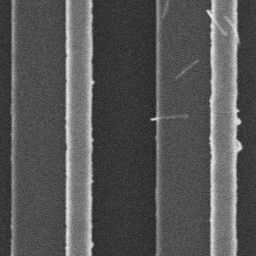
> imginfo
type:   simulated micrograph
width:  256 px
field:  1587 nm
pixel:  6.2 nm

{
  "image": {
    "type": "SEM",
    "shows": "lines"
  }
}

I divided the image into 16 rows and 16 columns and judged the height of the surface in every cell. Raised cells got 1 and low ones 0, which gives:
0111110000111110
0111110000111110
0111110000111110
0111110000111110
0111110000111110
0111110000111110
0111110000111110
0111110000111110
0111110000111110
0111110000111110
0111110000111110
0111110000111110
0111110000111110
0111110000111110
0111110000111110
0111110000111110